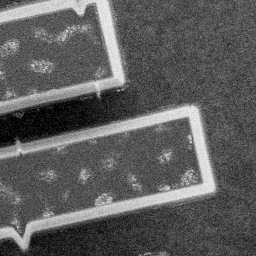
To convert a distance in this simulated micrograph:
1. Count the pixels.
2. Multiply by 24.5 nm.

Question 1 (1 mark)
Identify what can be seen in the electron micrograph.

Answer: one or a few lines or trenches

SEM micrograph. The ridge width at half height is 1960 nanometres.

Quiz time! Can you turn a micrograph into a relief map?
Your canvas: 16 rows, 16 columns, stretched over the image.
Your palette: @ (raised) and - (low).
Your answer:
---@@@----------
@@@@@@@---------
@@@@@@@---------
@@@@@@@---------
@@@@@@@---------
@@@@@@----------
@---------------
---------@@@----
-----@@@@@@@----
@@@@@@@@@@@@@---
@@@@@@@@@@@@@---
@@@@@@@@@@@@@---
@@@@@@@@@@------
@@@@@-----------
@@--------------
----------------